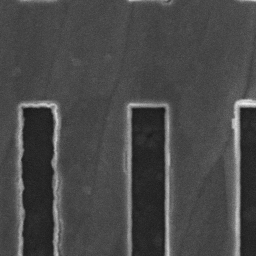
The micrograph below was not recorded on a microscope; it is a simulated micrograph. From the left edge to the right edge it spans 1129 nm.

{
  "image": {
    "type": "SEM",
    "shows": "one or a few lines or trenches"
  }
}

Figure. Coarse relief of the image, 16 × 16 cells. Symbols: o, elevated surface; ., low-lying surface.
oooooooooooooooo
oooooooooooooooo
oooooooooooooooo
oooooooooooooooo
oooooooooooooooo
oooooooooooooooo
oooooooooooooooo
o..ooooo..ooooo.
o..ooooo..ooooo.
o..ooooo..ooooo.
o..ooooo..ooooo.
o..ooooo..ooooo.
o..ooooo..ooooo.
o..ooooo..ooooo.
o..ooooo..ooooo.
o..ooooo..ooooo.